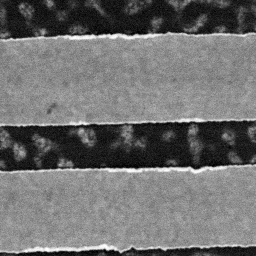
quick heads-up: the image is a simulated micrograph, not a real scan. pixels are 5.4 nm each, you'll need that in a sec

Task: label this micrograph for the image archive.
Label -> one or a few lines or trenches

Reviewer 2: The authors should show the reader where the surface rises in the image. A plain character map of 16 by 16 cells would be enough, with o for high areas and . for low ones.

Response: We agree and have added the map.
................
................
oooooooooooooooo
oooooooooooooooo
oooooooooooooooo
oooooooooooooooo
oooooooooooooooo
oooooooooooooooo
................
................
...........o.ooo
oooooooooooooooo
oooooooooooooooo
oooooooooooooooo
oooooooooooooooo
ooooooooooo.....